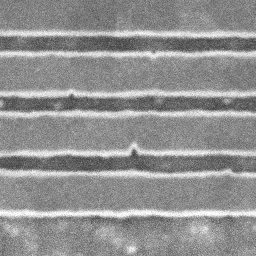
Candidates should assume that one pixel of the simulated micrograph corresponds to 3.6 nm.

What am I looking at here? parallel lines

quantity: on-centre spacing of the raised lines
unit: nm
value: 215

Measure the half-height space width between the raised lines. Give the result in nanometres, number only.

68.9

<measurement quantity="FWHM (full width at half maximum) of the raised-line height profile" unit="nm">148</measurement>